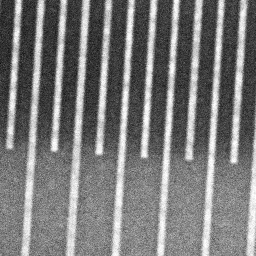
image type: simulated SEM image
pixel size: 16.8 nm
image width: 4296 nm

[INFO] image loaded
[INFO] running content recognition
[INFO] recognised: parallel lines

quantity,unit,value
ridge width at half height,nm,96.3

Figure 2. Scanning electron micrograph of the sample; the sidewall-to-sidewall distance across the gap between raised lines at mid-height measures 289 nm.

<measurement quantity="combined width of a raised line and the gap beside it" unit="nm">377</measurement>